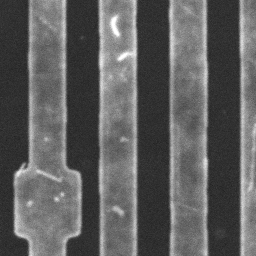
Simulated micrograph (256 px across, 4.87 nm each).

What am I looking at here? wiring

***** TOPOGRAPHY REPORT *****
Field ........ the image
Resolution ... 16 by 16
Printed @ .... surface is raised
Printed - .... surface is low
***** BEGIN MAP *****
--@@--@@---@@--@
--@@--@@---@@--@
--@@--@@---@@--@
--@@--@@---@@--@
--@@--@@---@@--@
--@@--@@---@@--@
--@@--@@---@@--@
--@@--@@---@@--@
--@@--@@---@@--@
--@@--@@---@@--@
--@@--@@---@@--@
-@@@@-@@---@@--@
-@@@@-@@---@@--@
-@@@@-@@---@@--@
-@@@@-@@---@@--@
--@@--@@---@@--@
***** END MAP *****